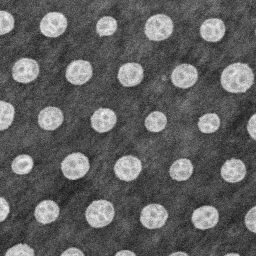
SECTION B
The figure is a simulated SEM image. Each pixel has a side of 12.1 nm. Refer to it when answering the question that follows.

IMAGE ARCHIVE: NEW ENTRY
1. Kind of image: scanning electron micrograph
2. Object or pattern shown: a regular array of raised bodies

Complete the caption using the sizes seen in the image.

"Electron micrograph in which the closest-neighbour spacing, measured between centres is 637 nm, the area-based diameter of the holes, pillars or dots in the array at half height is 290 nm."